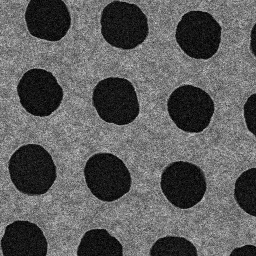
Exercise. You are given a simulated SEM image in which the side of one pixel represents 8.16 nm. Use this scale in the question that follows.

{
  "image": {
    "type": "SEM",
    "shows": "holes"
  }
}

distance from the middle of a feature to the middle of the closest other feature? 613 nanometres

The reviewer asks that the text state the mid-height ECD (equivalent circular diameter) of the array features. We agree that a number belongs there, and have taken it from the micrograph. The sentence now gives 383 nanometers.